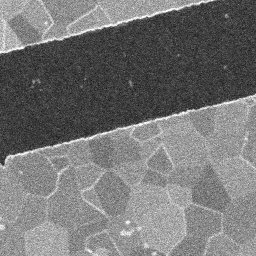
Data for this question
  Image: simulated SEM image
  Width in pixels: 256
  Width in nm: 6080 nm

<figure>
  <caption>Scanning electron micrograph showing one or a few lines or trenches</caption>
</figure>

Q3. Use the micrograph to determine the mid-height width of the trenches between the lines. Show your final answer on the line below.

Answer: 2420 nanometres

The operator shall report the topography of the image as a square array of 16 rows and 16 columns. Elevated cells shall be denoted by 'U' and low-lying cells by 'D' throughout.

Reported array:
UUUUUUUUUUUDDDDD
UUUUUUUUDDDDDDDD
UUUDDDDDDDDDDDDD
DDDDDDDDDDDDDDDD
DDDDDDDDDDDDDDDD
DDDDDDDDDDDDDDDD
DDDDDDDDDDDDDDUU
DDDDDDDDDDUUUUUU
DDDDDDUUUUUUUUUU
DDUUUUUUUUUUUUUU
UUUUUUUUUUUUUUUU
UUUUUUUUUUUUUUUU
UUUUUUUUUUUUUUUU
UUUUUUUUUUUUUUUU
UUUUUUUUUUUUUUUU
UUUUUUUUUUUUUUUU